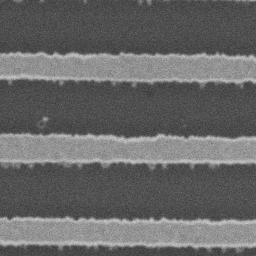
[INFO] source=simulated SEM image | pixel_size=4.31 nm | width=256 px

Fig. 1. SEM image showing lines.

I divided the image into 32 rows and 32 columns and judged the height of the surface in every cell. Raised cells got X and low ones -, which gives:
--------------------------------
--------------------------------
--------------------------------
--------------------------------
--------------------------------
--------------------------------
--------------------------------
XXXXXXXXXXXXXXXXXXXXXXXXXXXXXXXX
XXXXXXXXXXXXXXXXXXXXXXXXXXXXXXXX
XXXXXXXXXXXXXXXXXXXXXXXXXXXXXXXX
--------------------------------
--------------------------------
--------------------------------
--------------------------------
--------------------------------
--------------------------------
--------------------------------
XXXXXXXXXXXXXXXXXXXXXXXXXXXXXXXX
XXXXXXXXXXXXXXXXXXXXXXXXXXXXXXXX
XXXXXXXXXXXXXXXXXXXXXXXXXXXXXXXX
----------------------------X---
--------------------------------
--------------------------------
--------------------------------
--------------------------------
--------------------------------
--------------------------------
XXXXXXXXXXXXXXXX-XX-XX--XX--X---
XXXXXXXXXXXXXXXXXXXXXXXXXXXXXXXX
XXXXXXXXXXXXXXXXXXXXXXXXXXXXXXXX
XXXXXXXXXXXXXXXXXXXXXXXXXXXXXXXX
--------------------------------